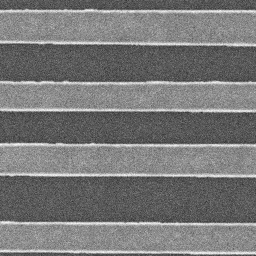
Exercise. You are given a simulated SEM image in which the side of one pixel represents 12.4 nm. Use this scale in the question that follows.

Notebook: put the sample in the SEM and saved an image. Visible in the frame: lines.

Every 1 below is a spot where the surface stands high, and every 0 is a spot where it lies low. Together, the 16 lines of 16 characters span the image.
0000000000000000
1111111111111111
1111111111111111
0000000000000000
0000000000000000
1111111111111111
1111111111111111
0000000000000000
0000000000000000
1111111111111111
1111111111111111
0000000000000000
0000000000000000
0000000000000000
1111111111111111
1111111111111111